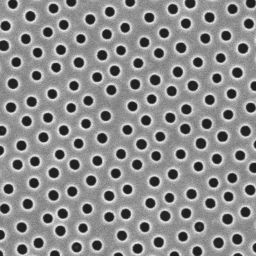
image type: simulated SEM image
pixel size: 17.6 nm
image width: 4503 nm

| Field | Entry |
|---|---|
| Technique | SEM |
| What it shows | a regular array of holes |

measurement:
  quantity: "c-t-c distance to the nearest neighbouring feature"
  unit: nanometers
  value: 348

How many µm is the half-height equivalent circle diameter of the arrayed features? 0.183